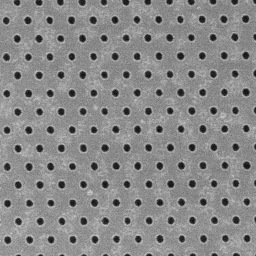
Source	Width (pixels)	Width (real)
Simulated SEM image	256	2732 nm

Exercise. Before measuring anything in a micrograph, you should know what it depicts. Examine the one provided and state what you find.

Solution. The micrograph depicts a regular array of holes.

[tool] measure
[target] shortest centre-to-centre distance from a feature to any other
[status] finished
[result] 0.225 um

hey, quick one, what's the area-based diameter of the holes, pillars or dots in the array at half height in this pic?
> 8.37 pixels